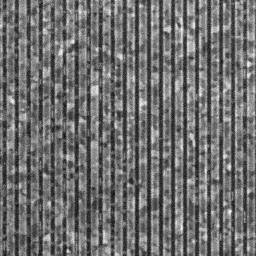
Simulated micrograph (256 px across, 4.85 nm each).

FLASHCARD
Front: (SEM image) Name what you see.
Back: parallel lines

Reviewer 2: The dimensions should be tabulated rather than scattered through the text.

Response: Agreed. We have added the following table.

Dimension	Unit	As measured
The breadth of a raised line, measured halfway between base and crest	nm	31.5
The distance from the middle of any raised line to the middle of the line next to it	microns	0.0582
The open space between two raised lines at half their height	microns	0.0267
